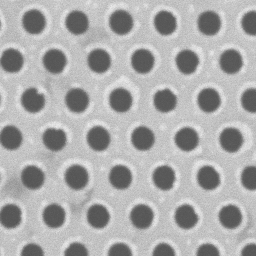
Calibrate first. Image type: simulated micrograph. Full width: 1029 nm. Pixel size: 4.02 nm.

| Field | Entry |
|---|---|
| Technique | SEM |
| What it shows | a regular array of holes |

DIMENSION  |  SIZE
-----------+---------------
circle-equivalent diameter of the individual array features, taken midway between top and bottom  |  88.9 nm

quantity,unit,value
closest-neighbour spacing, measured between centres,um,0.176